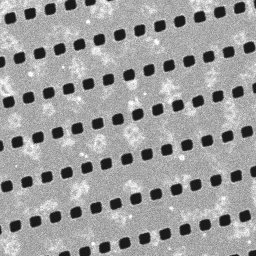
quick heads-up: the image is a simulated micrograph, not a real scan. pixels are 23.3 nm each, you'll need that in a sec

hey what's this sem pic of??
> a regular array of holes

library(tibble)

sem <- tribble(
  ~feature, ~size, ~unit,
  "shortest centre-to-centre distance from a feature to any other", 475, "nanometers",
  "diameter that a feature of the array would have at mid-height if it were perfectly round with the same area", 0.289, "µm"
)